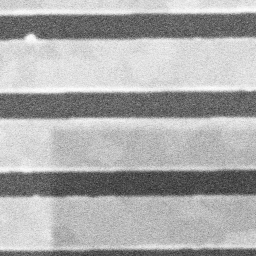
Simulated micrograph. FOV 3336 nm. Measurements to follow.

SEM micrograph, lines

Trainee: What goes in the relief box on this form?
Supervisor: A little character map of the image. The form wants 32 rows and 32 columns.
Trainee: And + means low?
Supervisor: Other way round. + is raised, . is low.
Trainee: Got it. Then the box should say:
++++++++++++++++++++++++++++++++
++++++++++++++++++++++++........
................................
................................
................................
++++++++++++++++++++++++++++++++
++++++++++++++++++++++++++++++++
++++++++++++++++++++++++++++++++
++++++++++++++++++++++++++++++++
++++++++++++++++++++++++++++++++
++++++++++++++++++++++++++++++++
................................
................................
................................
................................
++++++++++++++++++++++++++++++++
++++++++++++++++++++++++++++++++
++++++++++++++++++++++++++++++++
++++++++++++++++++++++++++++++++
++++++++++++++++++++++++++++++++
++++++++++++++++++++++++++++++++
................................
................................
................................
................................
++++++++++++++++++++++++++++++++
++++++++++++++++++++++++++++++++
++++++++++++++++++++++++++++++++
++++++++++++++++++++++++++++++++
++++++++++++++++++++++++++++++++
++++++++++++++++++++++++++++++++
................................